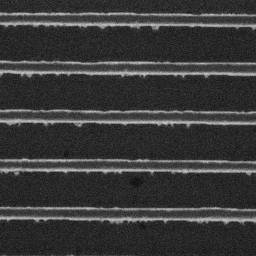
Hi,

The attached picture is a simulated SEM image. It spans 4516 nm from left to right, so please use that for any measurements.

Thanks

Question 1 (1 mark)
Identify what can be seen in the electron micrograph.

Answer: lines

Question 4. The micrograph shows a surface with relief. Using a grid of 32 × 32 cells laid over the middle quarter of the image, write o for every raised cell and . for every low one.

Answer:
oooooooooooooooooooooooooooooooo
oooooooooooooooooooooooooooooooo
..................oooooooooooooo
................................
................................
................................
................................
................................
................................
................................
................................
................................
oooooooooooooooooooooooooooooooo
oooooooooooooooooooooooooooooooo
............oooooooooooooooooooo
................................
................................
................................
................................
................................
................................
................................
................................
................................
oooooooooooooooooooooooooooooooo
oooooooooooooooooooooooooooooooo
.ooooooooooooooooooooooooooooooo
................................
................................
................................
................................
................................